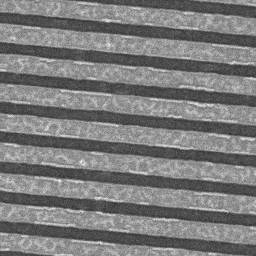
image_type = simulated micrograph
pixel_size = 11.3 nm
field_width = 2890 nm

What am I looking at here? parallel lines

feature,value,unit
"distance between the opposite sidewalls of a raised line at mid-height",200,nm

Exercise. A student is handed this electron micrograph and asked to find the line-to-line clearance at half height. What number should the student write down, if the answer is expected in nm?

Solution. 132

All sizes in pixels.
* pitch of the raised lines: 29.7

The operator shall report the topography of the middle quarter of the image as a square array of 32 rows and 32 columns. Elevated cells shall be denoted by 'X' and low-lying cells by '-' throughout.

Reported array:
XXXXXXXXXXXXXX------------------
XXXXXXXXXXXXXXXXXXXXXXXXX-------
XXXXXXXXXXXXXXXXXXXXXXXXXXXXXXXX
--XXXXXXXXXXXXXXXXXXXXXXXXXXXXXX
------------X-XXXXXXXXXXXXXXXXXX
-----------------------XXXXXXXXX
--------------------------------
XXXXXXXXXXX---------------------
XXXXXXXXXXXXXXXXXXXXX-----------
XXXXXXXXXXXXXXXXXXXXXXXXXXXXXXXX
XXXXXXXXXXXXXXXXXXXXXXXXXXXXXXXX
----------XXXXXXXXXXXXXXXXXXXXXX
------------------XXXXXXXXXXXXXX
-----------------------------XXX
XXXXXX--------------------------
XXXXXXXXXXXXXXXXX---------------
XXXXXXXXXXXXXXXXXXXXXXXXXXXX----
XXXXXXXXXXXXXXXXXXXXXXXXXXXXXXXX
----XXXXXXXXXXXXXXXXXXXXXXXXXXXX
---------------XXXXXXXXXXXXXXXXX
----------------------XX-XXXXXXX
XXX-----------------------------
XXXXXXXXXXX---------------------
XXXXXXXXXXXXXXXXXXXXXX----------
XXXXXXXXXXXXXXXXXXXXXXXXXXXXXXXX
XXXXXXXXXXXXXXXXXXXXXXXXXXXXXXXX
---------XXXXXXXXXXXXXXXXXXXXXXX
--------------------XXXXXXXXXXXX
-----------------------------XXX
XXXXXXX-------------------------
XXXXXXXXXXXXXXXXX---------------
XXXXXXXXXXXXXXXXXXXXXXXXXXXX-XX-